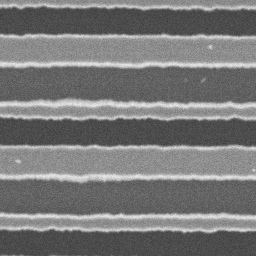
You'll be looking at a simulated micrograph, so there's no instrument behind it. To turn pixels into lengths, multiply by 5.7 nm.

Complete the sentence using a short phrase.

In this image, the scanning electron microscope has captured lines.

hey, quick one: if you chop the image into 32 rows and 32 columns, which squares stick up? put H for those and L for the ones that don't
HHHHHHHHHHHHHHHHHHHHHHHHHHHHHHHH
LLLLLLLLLLLLLLLLLLLLLLLLLLLLLLLL
LLLLLLLLLLLLLLLLLLLLLLLLLLLLLLLL
LLLLLLLLLLLLLLLLLLLLLLLLLLLLLLLL
HHLHHHHHHHHLHHHHLLLLHLLLLHLLLLLL
HHHHHHHHHHHHHHHHHHHHHHHHHHHHHHHH
HHHHHHHHHHHHHHHHHHHHHHHHHHHHHHHH
HHHHHHHHHHHHHHHHHHHHHHHHHHHHHHHH
LLLLLLLLLLLLLLLLLLLLLLLLLLLLLLLL
LLLLLLLLLLLLLLLLLLLLLLLLLLLLLLLL
LLLLLLLLLLLLLLLLLLLLLLLLLLLLLLLL
LLLLLLLLLLLLLLLLLLLLLLLLLLLLLLLL
LLLLLLLLLLLLLLLLLLLLLLLLLLLLLLLL
HHHHHHHHHHHHHHHHHHHHHHHHHHHHHHHH
HHHHHHHHHHHHHHHHHHHHHHHHHHHHHHHH
LLLLLLLLLLLLLLLLLLLLLLLLLLLLLLLL
LLLLLLLLLLLLLLLLLLLLLLLLLLLLLLLL
LLLLLLLLLLLLLLLLLLLLLLLLLLLLLLLL
HHHHHHHHHHHHHHHHHHHHHHHHHHHHHHHH
HHHHHHHHHHHHHHHHHHHHHHHHHHHHHHHH
HHHHHHHHHHHHHHHHHHHHHHHHHHHHHHHH
HHHHHHHHHHHHHHHHHHHHHHHHHHHHHHHH
LLLLLLLLLLLLLLLLLLLLLLLLLLLLLLLL
LLLLLLLLLLLLLLLLLLLLLLLLLLLLLLLL
LLLLLLLLLLLLLLLLLLLLLLLLLLLLLLLL
LLLLLLLLLLLLLLLLLLLLLLLLLLLLLLLL
LLLLLLLLLLLLLLLLLLLLLLLLLLLLLLLL
HHHHHHHHHHHHHHHHHHHHHHHHHHHHHHHH
HHHHHHHHHHHHHHHHHHHHHHHHHHHHHHHH
LLLLLLLLLLLLLLLLLLLLLLLLLLLLLLLL
LLLLLLLLLLLLLLLLLLLLLLLLLLLLLLLL
LLLLLLLLLLLLLLLLLLLLLLLLLLLLLLLL